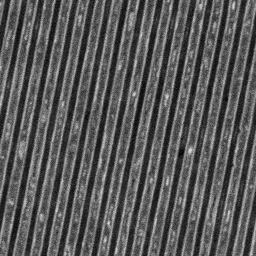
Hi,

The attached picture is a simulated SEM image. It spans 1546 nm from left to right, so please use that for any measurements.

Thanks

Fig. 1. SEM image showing parallel lines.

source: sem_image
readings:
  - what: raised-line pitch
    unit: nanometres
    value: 100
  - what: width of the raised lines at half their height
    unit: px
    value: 10.3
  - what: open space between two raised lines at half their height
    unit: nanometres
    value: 40.1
